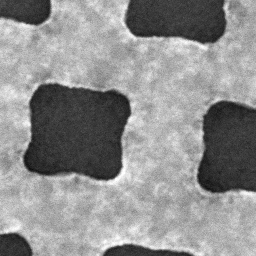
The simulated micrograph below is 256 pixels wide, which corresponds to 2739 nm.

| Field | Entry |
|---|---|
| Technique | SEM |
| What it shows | holes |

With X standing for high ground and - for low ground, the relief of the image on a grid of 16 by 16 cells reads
---XXXXX------XX
XX-XXXXX------XX
XXXXXXXXXXXX--XX
XXXXXXXXXXXXXXXX
XXXXXXXXXXXXXXXX
XX---XXXXXXXXXXX
XX------XXXXX--X
XX------XXXXX---
XX------XXXXX---
XX------XXXXX---
XX------XXXX----
XXXXXXXXXXXXX---
XXXXXXXXXXXXXXXX
XXXXXXXXXXXXXXXX
XXXXXXXXXXXXXXXX
--XXXXX--XXXXXXX